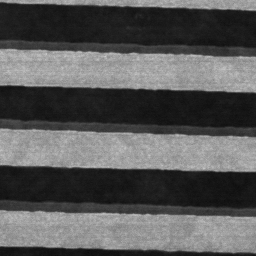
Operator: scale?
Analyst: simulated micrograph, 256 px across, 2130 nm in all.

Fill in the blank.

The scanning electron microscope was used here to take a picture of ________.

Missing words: lines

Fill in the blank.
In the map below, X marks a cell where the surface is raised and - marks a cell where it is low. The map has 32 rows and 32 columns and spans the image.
------XXXXXXXXXXXXXXXXXXXXXXXXXX
--------------------------------
--------------------------------
--------------------------------
--------------------------------
XXXXXXXXXXXX--------------------
XXXXXXXXXXXXXXXXXXXXXXXXXXXXXXXX
XXXXXXXXXXXXXXXXXXXXXXXXXXXXXXXX
XXXXXXXXXXXXXXXXXXXXXXXXXXXXXXXX
XXXXXXXXXXXXXXXXXXXXXXXXXXXXXXXX
XXXXXXXXXXXXXXXXXXXXXXXXXXXXXXXX
------------------------------XX
--------------------------------
--------------------------------
--------------------------------
XXXXXXXXXXXXXXX-----------------
XXXXXXXXXXXXXXXXXXXXXXXXXXXXXXXX
XXXXXXXXXXXXXXXXXXXXXXXXXXXXXXXX
XXXXXXXXXXXXXXXXXXXXXXXXXXXXXXXX
XXXXXXXXXXXXXXXXXXXXXXXXXXXXXXXX
XXXXXXXXXXXXXXXXXXXXXXXXXXXXXXXX
-----------------------------X--
--------------------------------
--------------------------------
--------------------------------
XXXXXXXXXXXX--------------------
XXXXXXXXXXXXXXXXXXXXXXXXXXXXXXXX
XXXXXXXXXXXXXXXXXXXXXXXXXXXXXXXX
XXXXXXXXXXXXXXXXXXXXXXXXXXXXXXXX
XXXXXXXXXXXXXXXXXXXXXXXXXXXXXXXX
XXXXXXXXXXXXXXXXXXXXXXXXXXXXXXXX
----------------------------XXXX